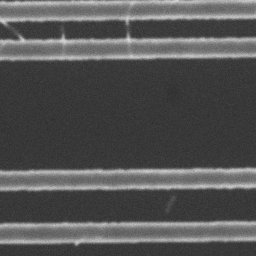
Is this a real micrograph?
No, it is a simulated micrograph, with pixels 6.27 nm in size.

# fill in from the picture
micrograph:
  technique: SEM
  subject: lines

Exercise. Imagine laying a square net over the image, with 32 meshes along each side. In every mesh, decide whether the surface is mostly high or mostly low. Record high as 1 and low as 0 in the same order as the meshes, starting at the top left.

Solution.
11111111111111111111111111111111
11111111111111111111111111111111
11111101000000010000000000000000
00000000000000000000000000000000
00000000000000000000000000000000
11111111111111111111111111111111
11111111111111111111111111111111
00000000000000000000000000000000
00000000000000000000000000000000
00000000000000000000000000000000
00000000000000000000000000000000
00000000000000000000000000000000
00000000000000000000000000000000
00000000000000000000000000000000
00000000000000000000000000000000
00000000000000000000000000000000
00000000000000000000000000000000
00000000000000000000000000000000
00000000000000000000000000000000
00000000000000000000000000000000
00000000000000000000000000000000
11111111111111111111111111111111
11111111111111111111111111111111
11111111111111111111111111011000
00000000000000000000000000000000
00000000000000000000000000000000
00000000000000000000000000000000
00000000000000000000000000000000
11111111111111111111111111111111
11111111111111111111111111111111
00000000000000000000000000000000
00000000000000000000000000000000